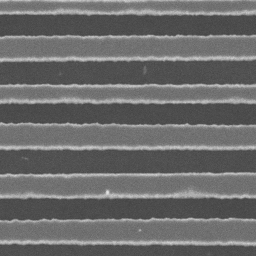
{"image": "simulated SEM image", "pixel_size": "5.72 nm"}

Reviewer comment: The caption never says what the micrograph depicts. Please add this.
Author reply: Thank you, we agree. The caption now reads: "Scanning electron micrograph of lines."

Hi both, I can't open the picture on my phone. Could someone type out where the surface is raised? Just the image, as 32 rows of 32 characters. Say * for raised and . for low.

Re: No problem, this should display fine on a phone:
********************************
********************************
................................
................................
........*....*....**..***.******
********************************
********************************
**************************..***.
................................
................................
................................
********************************
********************************
................................
................................
***************.................
********************************
********************************
********************************
................................
................................
................................
********************************
********************************
********************************
................................
................................
.....**.....********************
********************************
********************************
***.*.*.************************
................................